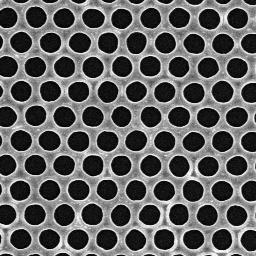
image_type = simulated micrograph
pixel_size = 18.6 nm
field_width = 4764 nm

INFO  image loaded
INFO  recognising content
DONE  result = a regular array of holes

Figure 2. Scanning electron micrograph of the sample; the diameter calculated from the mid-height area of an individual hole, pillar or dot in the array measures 396 nanometres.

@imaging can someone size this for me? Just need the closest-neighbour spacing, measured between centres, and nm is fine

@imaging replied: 521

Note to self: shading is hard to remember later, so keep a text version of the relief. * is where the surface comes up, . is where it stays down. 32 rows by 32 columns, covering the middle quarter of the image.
...**.....**.....**.....**.....*
...**.....**.....**.....**.....*
..***....****...****....***....*
.*****..************************
***..*****..*****..*************
*.....***....***....***....****.
*.....**......*......**.....**..
*.....**.....**......*......**..
**....***....***....***....***..
***.******..*****.******..*****.
********************************
..***....***....****....***....*
...**.....**.....**.....**.....*
...*......**.....**.....**.....*
...**.....**.....**.....**.....*
..****...****..******..*****..**
********************************
**....***....***....***....****.
*.....**......*......**.....**..
*.....**......*......*......**..
*.....**.....**.....***.....**..
**...****...*****..*****...***..
********************************
..***....****...****...****...**
...**.....**.....**.....**.....*
...*......**.....**.....**.....*
...**.....**.....**.....**.....*
..****...****...****...****....*
********************************
**...****....***....****..****..
*.....**.....***....***....***..
*......*.....**......*......*...